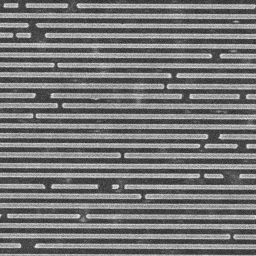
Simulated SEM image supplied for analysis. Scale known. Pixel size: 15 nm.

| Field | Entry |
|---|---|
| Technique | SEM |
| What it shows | parallel lines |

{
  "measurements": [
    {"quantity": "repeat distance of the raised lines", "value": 150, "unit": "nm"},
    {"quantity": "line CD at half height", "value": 0.0674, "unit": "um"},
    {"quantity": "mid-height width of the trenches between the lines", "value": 89.8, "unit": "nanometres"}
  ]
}